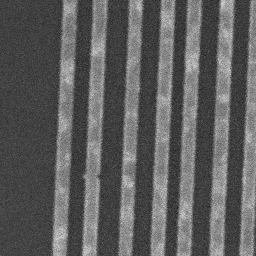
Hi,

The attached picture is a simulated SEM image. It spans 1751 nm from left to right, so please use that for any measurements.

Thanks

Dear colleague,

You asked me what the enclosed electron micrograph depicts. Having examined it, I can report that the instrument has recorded parallel lines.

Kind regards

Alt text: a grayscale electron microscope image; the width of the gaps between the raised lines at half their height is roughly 130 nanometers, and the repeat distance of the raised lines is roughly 214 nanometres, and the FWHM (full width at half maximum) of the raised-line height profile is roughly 0.0829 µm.